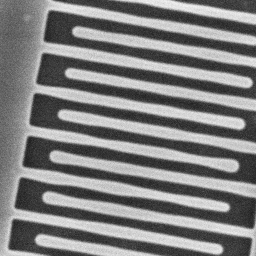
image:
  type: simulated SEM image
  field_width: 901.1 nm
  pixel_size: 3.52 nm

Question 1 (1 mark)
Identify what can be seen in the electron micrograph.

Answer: groups of lines, slits or small figures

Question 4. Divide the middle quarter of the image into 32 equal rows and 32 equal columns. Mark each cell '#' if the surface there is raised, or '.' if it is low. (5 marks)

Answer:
...............#############....
.###..................##########
#########..................#####
..#############.................
.........###########............
.............#############......
###.................############
#######.................########
##############.................#
.....##############.............
...........##############.......
.................#############..
######................##########
###########..................###
...###############..............
.........##############.........
...............##############...
###..................###########
########.................#######
.##############.................
........############............
.............##############.....
#..................############.
######..................########
#############..................#
....##############..............
..........##############........
................#############...
#####................###########
#############...............####
..###############...............
........##############..........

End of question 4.